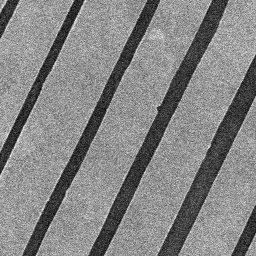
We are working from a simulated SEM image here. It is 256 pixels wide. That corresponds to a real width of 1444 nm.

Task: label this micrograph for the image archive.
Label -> one or a few lines or trenches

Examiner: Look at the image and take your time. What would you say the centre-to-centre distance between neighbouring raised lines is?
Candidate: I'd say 355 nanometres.